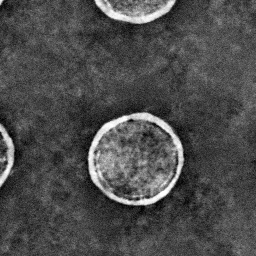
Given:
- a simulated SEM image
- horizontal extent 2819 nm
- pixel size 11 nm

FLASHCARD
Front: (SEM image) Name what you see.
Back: raised bodies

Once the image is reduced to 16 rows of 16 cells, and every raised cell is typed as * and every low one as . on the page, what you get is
.......***......
................
................
................
................
................
................
........**......
......*****.....
*.....*****.....
*.....*****.....
......*****.....
.......***......
................
................
................